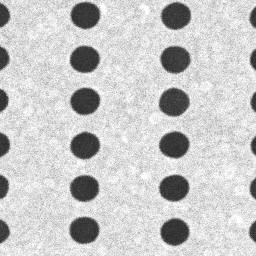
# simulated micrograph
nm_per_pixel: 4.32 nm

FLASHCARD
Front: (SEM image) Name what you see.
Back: a regular array of holes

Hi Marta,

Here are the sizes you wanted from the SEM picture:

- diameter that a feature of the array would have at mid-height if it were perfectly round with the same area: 124 nm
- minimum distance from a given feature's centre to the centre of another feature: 184 nanometres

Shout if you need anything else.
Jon